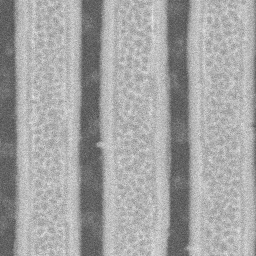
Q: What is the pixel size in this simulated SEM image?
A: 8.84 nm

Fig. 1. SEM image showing one or a few lines or trenches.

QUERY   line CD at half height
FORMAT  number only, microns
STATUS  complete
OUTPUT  0.468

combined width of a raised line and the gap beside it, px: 86.8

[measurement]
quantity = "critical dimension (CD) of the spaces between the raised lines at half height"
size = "296 nm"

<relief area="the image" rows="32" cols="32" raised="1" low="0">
00011111100000111111000001111110
00011111100000111111000001111110
00011111100000111111000011111110
00011111100000111111000011111110
00011111100000111111000011111110
00011111100000111111000011111110
00011111100000111111000011111110
00011111100000111111000011111110
00011111100001111111000011111110
00011111100001111111000011111110
00011111100001111111000011111110
00011111100001111111000001111110
00011111100001111111000001111110
00011111100001111111000001111110
00011111100001111111000011111110
00011111100001111111000011111110
00011111100001111111000001111110
00011111100001111111000001111110
00011111100001111111000001111110
00011111100000111111000001111110
00011111100000111111000001111110
00011111100000111111000001111110
00011111100000111111000001111110
00011111100000111111000001111110
00011111100000111111000001111110
00011111100000111111000001111110
00011111100000111111000001111110
00011111100000111111000001111110
00011111100000111111000001111110
00011111100000111111000001111110
00011111100000111111000011111110
00011111100000111111000011111110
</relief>